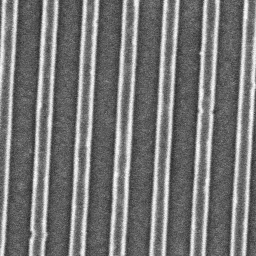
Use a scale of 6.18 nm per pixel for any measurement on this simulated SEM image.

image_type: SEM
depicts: parallel lines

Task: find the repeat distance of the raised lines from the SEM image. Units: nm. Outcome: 248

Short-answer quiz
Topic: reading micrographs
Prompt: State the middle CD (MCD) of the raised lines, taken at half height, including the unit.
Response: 78.6 nm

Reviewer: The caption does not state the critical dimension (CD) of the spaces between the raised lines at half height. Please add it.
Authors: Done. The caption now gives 0.167 µm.